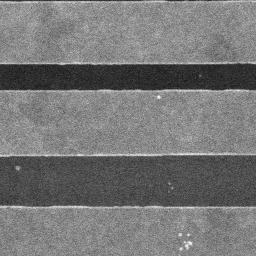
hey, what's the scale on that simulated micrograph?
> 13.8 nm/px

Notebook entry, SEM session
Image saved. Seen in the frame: lines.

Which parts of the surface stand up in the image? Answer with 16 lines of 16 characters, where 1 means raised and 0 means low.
1111111111111111
1111111111111111
1111111111111111
1111111111111111
0000000000000000
0000000000000000
1111111111111111
1111111111111111
1111111111111111
1111111111111111
0000000000000000
0000000000000000
0000000000000000
1111111111111111
1111111111111111
1111111111111111